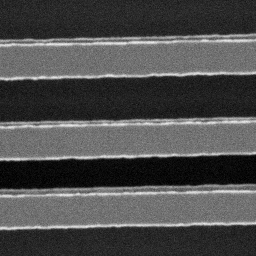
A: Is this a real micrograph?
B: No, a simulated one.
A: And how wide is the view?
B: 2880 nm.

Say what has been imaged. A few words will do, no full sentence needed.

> lines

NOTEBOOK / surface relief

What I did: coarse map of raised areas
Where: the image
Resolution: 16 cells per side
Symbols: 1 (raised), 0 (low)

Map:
0000000000000000
0000000000000000
0001111111111111
1111111111111111
1111111111111111
0000000000000000
0000000000000000
0000000001111111
1111111111111111
1111111111111111
0000000000000000
0000000000000000
1111111111111111
1111111111111111
0000000000000000
0000000000000000